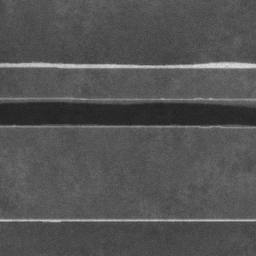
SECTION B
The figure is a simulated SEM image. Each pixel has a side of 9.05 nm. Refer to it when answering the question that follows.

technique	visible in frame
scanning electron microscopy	lines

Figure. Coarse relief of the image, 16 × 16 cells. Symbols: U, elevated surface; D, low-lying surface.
DDDDDDDDDDDDDDDD
DDDDDDDDDDDDDDDD
DDDDDDDDDDDDDDDD
DDDDDDDDDDDDDDDD
UUUUUUUUUUUUUUUU
UUUUUUUUUUUUUUUU
DDDDDDDDDDDDDDDD
DDDDDDDDDDDDDDDD
UUUUUUUUUUUUUUUU
UUUUUUUUUUUUUUUU
UUUUUUUUUUUUUUUU
UUUUUUUUUUUUUUUU
UUUUUUUUUUUUUUUU
UUUUUUUUUUUUUUUU
DDDDDDDDDDDDDDDD
DDDDDDDDDDDDDDDD